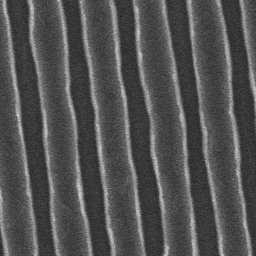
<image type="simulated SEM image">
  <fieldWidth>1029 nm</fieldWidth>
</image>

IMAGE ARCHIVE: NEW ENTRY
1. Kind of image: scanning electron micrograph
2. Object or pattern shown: parallel lines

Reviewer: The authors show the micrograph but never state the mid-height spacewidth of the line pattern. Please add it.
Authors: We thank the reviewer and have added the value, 80.3 nanometres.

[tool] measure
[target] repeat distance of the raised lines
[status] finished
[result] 53 px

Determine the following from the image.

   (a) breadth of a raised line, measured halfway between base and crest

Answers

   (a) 133 nanometres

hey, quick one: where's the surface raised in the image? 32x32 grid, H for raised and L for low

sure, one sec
HLLLHHHHLLHHHHLLLHHHHLLLHHHLLLHH
HLLLHHHHLLHHHHLLLHHHHLLLHHHHLLHH
HLLLHHHHLLHHHHLLLHHHHLLLHHHHLLHH
HLLLHHHHLLHHHHHLLHHHHLLLHHHHLLHH
HLLLHHHHLLHHHHHLLHHHHLLLHHHHLLLH
HLLLHHHHLLLHHHHLLHHHHLLLHHHHLLLH
HHLLHHHHLLLHHHHLLHHHHLLLHHHHHLLH
HHLLHHHHLLLHHHHLLHHHHHLLHHHHHLLH
HHLLLHHHLLLHHHHLLHHHHHLLHHHHHLLH
HHLLLHHHHLLHHHHLLLHHHHLLHHHHHLLH
HHLLLHHHHLLHHHHLLLHHHHLLLHHHHLLH
HHLLLHHHHLLHHHHHLLHHHHLLLHHHHLLL
HHLLLHHHHLLLHHHHLLHHHHLLLHHHHLLL
HHLLLHHHHLLLHHHHLLHHHHHLLHHHHLLL
HHLLLHHHHLLLHHHHLLLHHHHLLHHHHLLL
HHHLLHHHHLLLHHHHLLLHHHHLLHHHHLLL
HHHLLLHHHHLLHHHHLLLHHHHLLHHHHHLL
HHHLLLHHHHLLHHHHLLLHHHHLLHHHHHLL
HHHLLLHHHHLLHHHHLLLHHHHLLHHHHHLL
HHHLLLHHHHLLHHHHLLLHHHHLLLHHHHLL
HHHLLLHHHHLLLHHHHLLHHHHLLLHHHHLL
HHHLLLHHHHLLLHHHHLLHHHHHLLHHHHLL
HHHHLLHHHHLLLHHHHLLLHHHHLLHHHHLL
HHHHLLHHHHLLLHHHHLLLHHHHLLHHHHLL
HHHHLLHHHHLLLHHHHLLLHHHHLLLHHHLL
HHHHLLHHHHLLLHHHHLLLHHHHLLLHHHHL
HHHHLLHHHHHLLHHHHLLLHHHHLLLHHHHL
HHHHLLLHHHHLLHHHHLLLHHHHLLLHHHHL
HHHHLLLHHHHLLHHHHHLLHHHHLLLHHHHL
HHHHLLLHHHHLLLHHHHLLLHHHLLLHHHHL
HHHHHLLHHHHLLLHHHHLLLHHHLLLHHHHL
LHHHHLLHHHHLLLHHHHLLLHHHHLLLHHHL